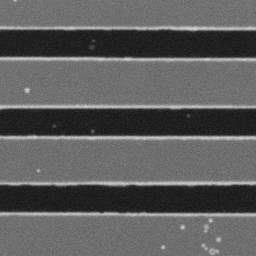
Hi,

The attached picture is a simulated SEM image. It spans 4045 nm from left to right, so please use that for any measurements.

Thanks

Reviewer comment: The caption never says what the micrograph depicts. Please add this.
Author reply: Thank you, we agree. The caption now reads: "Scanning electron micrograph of lines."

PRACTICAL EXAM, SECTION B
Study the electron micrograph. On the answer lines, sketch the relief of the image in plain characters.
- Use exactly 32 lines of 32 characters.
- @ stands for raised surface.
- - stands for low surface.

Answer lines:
@@@@@@@@@@@@@@@@@@@@@@@@@@@@@@@@
@@@@@@@@@@@@@@@@@@@@@@@@@@@@@@@@
@@@@@@@@@@@@@@@@@@@@@@@@@@@@@@@@
-@@@@@@-@-@@-@@@@@@@-@@@@@@@@@@@
--------------------------------
--------------------------------
--------------------------------
@@@@@@@@@@@@@@@@@@@@@@@@@@@@@@@@
@@@@@@@@@@@@@@@@@@@@@@@@@@@@@@@@
@@@@@@@@@@@@@@@@@@@@@@@@@@@@@@@@
@@@@@@@@@@@@@@@@@@@@@@@@@@@@@@@@
@@@@@@@@@@@@@@@@@@@@@@@@@@@@@@@@
@@@@@@@@@@@@@@@@@@@@@@@@@@@@@@@@
--------------------------------
--------------------------------
--------------------------------
--------------------------------
@@@@@@@@@@@@@@@@@@@@@@@@@@@@@@@@
@@@@@@@@@@@@@@@@@@@@@@@@@@@@@@@@
@@@@@@@@@@@@@@@@@@@@@@@@@@@@@@@@
@@@@@@@@@@@@@@@@@@@@@@@@@@@@@@@@
@@@@@@@@@@@@@@@@@@@@@@@@@@@@@@@@
@@@@@@@@@@@@@@@@@@@@@@@@@@@@@@@@
--------------------------------
--------------------------------
--------------------------------
--------------------------------
@@@@@@@@@@@@@@@@@@@@@@@@@@@@@@@@
@@@@@@@@@@@@@@@@@@@@@@@@@@@@@@@@
@@@@@@@@@@@@@@@@@@@@@@@@@@@@@@@@
@@@@@@@@@@@@@@@@@@@@@@@@@@@@@@@@
@@@@@@@@@@@@@@@@@@@@@@@@@@@@@@@@